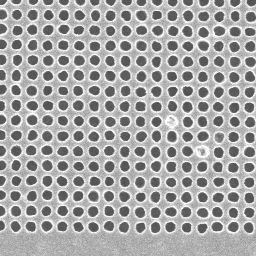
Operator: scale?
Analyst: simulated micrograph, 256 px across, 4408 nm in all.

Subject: a regular array of holes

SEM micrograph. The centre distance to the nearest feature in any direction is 255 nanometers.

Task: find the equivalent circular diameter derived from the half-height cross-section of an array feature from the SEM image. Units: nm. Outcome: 177